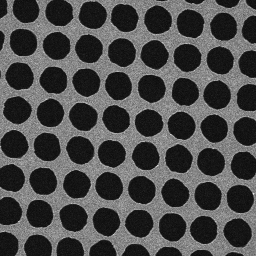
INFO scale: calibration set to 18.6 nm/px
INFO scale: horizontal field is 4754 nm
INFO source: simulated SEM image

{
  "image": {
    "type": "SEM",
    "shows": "a regular array of holes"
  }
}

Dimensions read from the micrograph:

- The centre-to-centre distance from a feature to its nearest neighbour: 32.8 pixels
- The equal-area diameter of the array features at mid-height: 516 nm